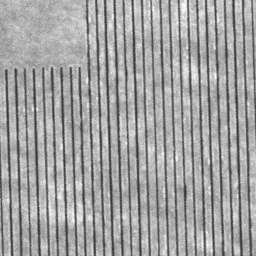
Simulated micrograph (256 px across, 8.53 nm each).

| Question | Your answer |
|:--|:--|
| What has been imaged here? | parallel lines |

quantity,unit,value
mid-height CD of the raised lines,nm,58.6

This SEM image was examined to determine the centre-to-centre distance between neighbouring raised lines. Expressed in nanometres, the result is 78.3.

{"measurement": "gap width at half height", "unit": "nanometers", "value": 22.4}